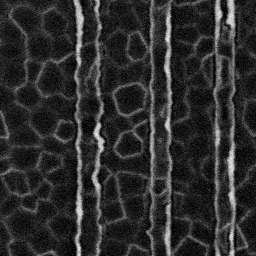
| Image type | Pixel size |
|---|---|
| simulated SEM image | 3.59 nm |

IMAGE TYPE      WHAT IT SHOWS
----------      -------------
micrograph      one or a few lines or trenches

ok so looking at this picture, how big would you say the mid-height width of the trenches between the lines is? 0.169 um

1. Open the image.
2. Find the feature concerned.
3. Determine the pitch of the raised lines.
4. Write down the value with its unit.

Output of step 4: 244 nm